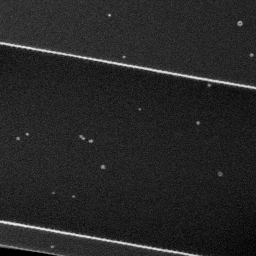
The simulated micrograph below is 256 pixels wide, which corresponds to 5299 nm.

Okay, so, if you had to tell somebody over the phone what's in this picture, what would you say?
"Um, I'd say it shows lines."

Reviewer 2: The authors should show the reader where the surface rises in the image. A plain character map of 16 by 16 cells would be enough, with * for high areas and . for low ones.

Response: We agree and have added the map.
****************
****************
****************
.....***********
..........******
................
................
................
................
................
................
................
................
................
****............
.********.......